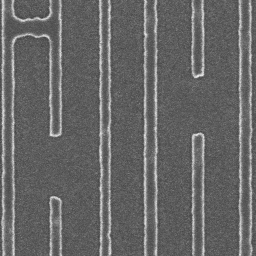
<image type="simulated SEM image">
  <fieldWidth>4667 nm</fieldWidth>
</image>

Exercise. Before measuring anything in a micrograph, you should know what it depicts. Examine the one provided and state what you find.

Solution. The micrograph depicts parallel lines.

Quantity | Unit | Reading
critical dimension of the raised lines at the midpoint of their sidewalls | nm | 205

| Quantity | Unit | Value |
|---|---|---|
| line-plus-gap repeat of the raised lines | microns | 0.865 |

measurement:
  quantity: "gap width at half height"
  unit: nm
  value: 666